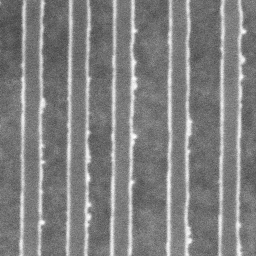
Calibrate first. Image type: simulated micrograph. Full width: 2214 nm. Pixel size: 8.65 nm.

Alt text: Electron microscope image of lines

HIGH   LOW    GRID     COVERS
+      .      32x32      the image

...++....++...+++....+++....++..
...++....++...+++....+++....++..
...++....++...+++....+++....++..
...++....++...+++....+++....++..
...++....++...+++....+++....++..
...++....++...+++....++.....++..
...++....++...+++....+++....++..
...++....++...+++....+++....++..
...++....++...+++....+++....++..
...++....++...+++....+++....++..
...++....++...+++....+++....++..
...++....++...+++....+++....++..
...++....++...+++....++.....++..
...++....++...+++....++.....++..
...++....++...+++....+++....++..
...++....++...++.....+++....++..
...++....++...+++....+++....++..
...++....++...+++....++.....++..
...++....++...++.....++.....++..
...++....++...++.....++.....++..
...++....++...++.....++.....++..
...++....++...++.....++.....++..
...++....++...++.....++.....++..
...++....++...++.....++.....++..
...++....++...++.....+++....++..
...++....++...++.....++.....++..
...++....++...++.....++.....++..
...++....++...++.....++....+++..
...++....++...++.....++....+++..
...++...+++...++.....++....+++..
...++...+++...++.....++....+++..
...++...+++...++.....++....+++..